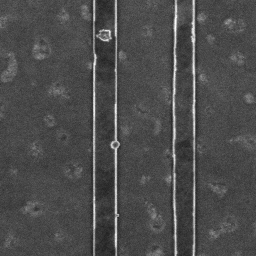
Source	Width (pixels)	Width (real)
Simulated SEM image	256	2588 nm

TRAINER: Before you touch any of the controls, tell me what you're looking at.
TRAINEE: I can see one or a few lines or trenches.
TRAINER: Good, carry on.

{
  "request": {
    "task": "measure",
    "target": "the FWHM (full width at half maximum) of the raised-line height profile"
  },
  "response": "220 nm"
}